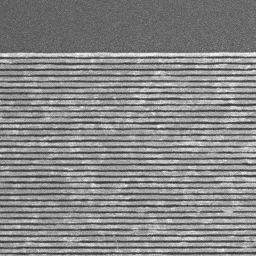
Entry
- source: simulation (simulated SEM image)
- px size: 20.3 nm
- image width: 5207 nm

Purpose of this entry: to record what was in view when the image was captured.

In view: parallel lines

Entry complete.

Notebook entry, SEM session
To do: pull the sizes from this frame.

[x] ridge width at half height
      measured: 81.4 nanometres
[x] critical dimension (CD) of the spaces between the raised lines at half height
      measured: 0.0407 microns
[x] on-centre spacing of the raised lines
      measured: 5.92 pixels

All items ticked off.